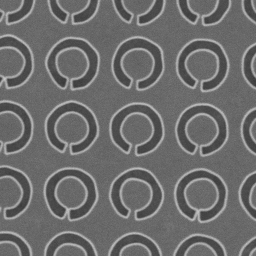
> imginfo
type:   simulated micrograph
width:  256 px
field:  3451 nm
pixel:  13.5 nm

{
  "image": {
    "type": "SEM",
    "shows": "an array of small figures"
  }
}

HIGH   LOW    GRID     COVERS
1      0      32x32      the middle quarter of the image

11111100011100011111110001110011
11111100111100011111110001110001
11111000111110011111110011111001
11110001111110001111100011111000
01000001111111000110000111111100
01000011111111101100001111111110
11111111111111111111111111111111
11111111111111111111111111111111
11111111111111111111111111111111
10011111111111111111111111111111
00000111111111110000011111111111
00000011111111000000000111111100
11110001111110000111000011111100
11111000111100011111100011111000
11111100111100011111110011110001
11111100111100111111110001110001
11111100011100111111110001110001
11111100111100111111110001110001
11111000111100011111110001110001
11110001111110001111000011111000
11000011111111000110000111111000
11000111111111101100001111111100
11111111111111111100111111111111
11111111111111111111111111111111
11111111111111111111111111111111
11111111111111111111111111111111
00001111111111110000111111111111
00000011111111100000001111111110
11100001111110000000000111111100
11110000111100011111000111111000
11111000111100011111100011110001
11111100111100111111110011110011